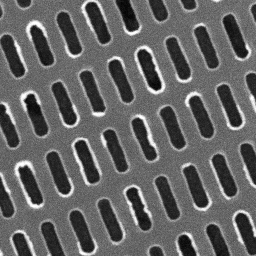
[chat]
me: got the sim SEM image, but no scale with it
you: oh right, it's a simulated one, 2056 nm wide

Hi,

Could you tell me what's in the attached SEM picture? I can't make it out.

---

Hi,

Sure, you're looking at a regular array of holes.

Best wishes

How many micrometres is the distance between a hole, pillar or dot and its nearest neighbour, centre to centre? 0.245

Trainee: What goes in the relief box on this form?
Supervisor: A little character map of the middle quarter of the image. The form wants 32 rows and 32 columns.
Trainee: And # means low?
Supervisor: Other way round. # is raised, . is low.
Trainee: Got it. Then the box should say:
###########....####....####....#
#####.#####....#####...#####....
####...#####...#####...#####....
####....#.##....####....#####..#
####....####....#####...########
#####...#####....#.##...########
.####....####....#####..########
.####....#####...###############
.#####....####...##############.
..####....#####..##############.
..#####...#####################.
..#####...##############...#####
...#############.#######....####
...###############.##.##....####
...##############...#.###...####
#################...#####....###
###########.#####....#####...###
##########...####....#####....##
##########...#####...#####....##
###...#####...#####..######...##
##....#####...#####...#####...##
###...#####....####....#########
###....#####...#####...#########
####...#####...#####...#########
####....####....################
#####...#####...###############.
#####....####...##############..
.####....#####################..
.#####...##############...####..
.#####...##############...#####.
..#####################...#####.
..##############...####....####.